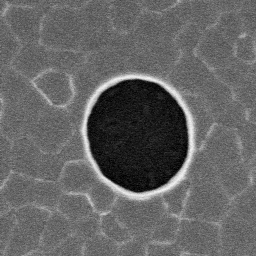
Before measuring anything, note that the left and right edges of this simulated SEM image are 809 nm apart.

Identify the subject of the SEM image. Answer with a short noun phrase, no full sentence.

holes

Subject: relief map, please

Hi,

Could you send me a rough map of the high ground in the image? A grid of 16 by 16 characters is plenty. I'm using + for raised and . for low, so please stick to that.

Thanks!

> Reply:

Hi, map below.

++++++++++++++++
++++++++++++++++
++++++++++++++++
++++++++++++++++
++++++++++++++++
+++++++...++++++
++++++.....+++++
+++++.......++++
+++++.......++++
++++++......++++
++++++.....+++++
+++++++....+++++
++++++++++++++++
++++++++++++++++
++++++++++++++++
++++++++++++++++